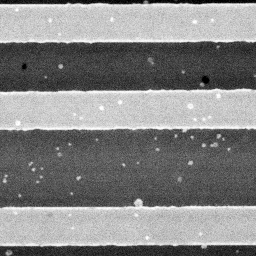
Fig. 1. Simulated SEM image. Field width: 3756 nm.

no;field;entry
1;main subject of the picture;lines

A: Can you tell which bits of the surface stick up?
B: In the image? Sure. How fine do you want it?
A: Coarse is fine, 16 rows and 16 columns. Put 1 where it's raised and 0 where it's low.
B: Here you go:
1111111111111111
1111111111111111
1111111111111111
0000000000000000
0000000000000000
0000000000000000
1111111111111111
1111111111111111
0000000000000000
0000000000000000
0000000000000000
0000000000000000
0000000000000000
1111111111111111
1111111111111111
0000000000000000